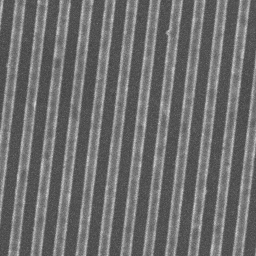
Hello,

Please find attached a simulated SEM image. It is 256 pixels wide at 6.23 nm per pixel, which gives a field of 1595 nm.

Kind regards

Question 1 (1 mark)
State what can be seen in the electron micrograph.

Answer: parallel lines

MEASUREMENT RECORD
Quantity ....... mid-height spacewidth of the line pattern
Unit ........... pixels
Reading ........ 13.3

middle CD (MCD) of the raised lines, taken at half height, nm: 55.6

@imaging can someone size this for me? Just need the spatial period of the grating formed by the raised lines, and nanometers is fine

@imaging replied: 139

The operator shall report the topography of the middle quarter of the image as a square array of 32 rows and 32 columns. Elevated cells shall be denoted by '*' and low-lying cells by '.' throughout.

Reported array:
...**....**...**....**....**...*
...**....**...**....**...**....*
...**....**...**....**...**....*
...**...**....**....**...**....*
..***...**....**...***...**....*
..***...**....**...**....**....*
..***...**...***...**....**...**
..**....**....**...**....**...**
..**....**...**....**....**...**
..**....**...**....**...***...**
..**....**...**....**...**....**
..**...***...**....**...**....**
..**...**....**....*....**....**
..**...**....**...***...**....**
.***...**....**...**....**...***
.**....**...***...**....**...**.
.**....**...***...**....**...**.
.**....**...**....**....**...**.
.**....**...**....**...***...**.
.**....*....**....**...**....**.
.**...**....**....**...**....**.
***...**....**...**....**....**.
***...**....**...**....**....**.
***...**...***...**....**...***.
**....**...***...**....**...**..
**....**...***...**....**...**..
**....**...**....**....**...**..
**....**...**....**...**....**..
**....*....**....**...**....**..
**...**....**....**...**....**..
**...**....**...***...**....**..
**...**....**...**....**....**..